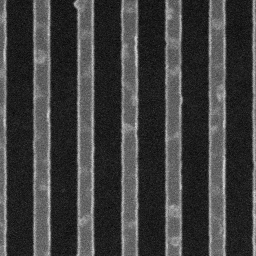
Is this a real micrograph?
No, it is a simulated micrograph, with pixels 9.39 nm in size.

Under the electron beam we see parallel lines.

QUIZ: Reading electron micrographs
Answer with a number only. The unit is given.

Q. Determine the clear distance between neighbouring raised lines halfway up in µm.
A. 0.269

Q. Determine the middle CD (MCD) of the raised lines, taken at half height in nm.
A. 147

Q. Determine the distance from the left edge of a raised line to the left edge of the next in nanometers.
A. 411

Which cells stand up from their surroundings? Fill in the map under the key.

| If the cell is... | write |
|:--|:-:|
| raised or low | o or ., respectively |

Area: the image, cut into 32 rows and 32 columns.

o...oo...ooo...oo....oo...oo....
o...oo....oo...oo....oo...oo....
o...oo....oo...oo....oo...oo....
o...oo....oo...oo....oo...oo....
o...oo....oo...oo....oo...oo....
o...oo....oo...oo....oo...oo....
o...oo....oo...oo....oo...oo....
o...oo....oo...oo....oo...oo....
o...oo....oo...oo....oo...oo....
o...oo....oo...oo....oo...oo....
o...oo....oo...oo....oo...oo....
o...oo....oo...oo....oo...oo....
o...oo....oo...oo....oo...oo....
o...oo....oo...oo....oo...oo....
o...oo....oo...oo....oo...oo....
o...oo....oo...oo....oo...oo....
o...oo....oo...oo....oo...oo....
o...oo....oo...oo....oo...oo....
o...oo....oo...oo....oo...oo....
o...oo....oo...oo....oo...oo....
o...oo....oo...oo....oo...oo....
o...oo....oo...oo....oo...oo....
o...oo....oo...oo....oo...oo....
o...oo....oo...oo....oo...oo....
o...oo....oo...oo....oo...oo....
o...oo....oo...oo....oo...oo....
o...oo....oo...oo....oo...oo....
o...oo....oo...oo....oo...oo....
o...oo....oo...oo....oo...oo....
o...oo....oo...oo....oo...oo....
o...oo....oo...oo....oo...oo....
o...oo....oo...oo....oo...oo....